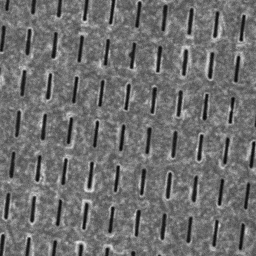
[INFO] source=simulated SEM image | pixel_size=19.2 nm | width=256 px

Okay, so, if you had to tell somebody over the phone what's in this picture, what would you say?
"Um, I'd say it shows a regular array of holes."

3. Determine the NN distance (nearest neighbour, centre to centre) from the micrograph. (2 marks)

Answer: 504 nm